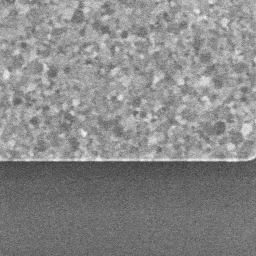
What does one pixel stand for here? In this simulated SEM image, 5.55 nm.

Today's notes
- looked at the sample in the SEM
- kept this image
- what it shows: wiring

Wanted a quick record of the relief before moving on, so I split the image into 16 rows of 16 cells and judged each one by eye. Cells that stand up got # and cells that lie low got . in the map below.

################
################
################
################
################
################
################
################
################
################
................
................
................
................
................
................